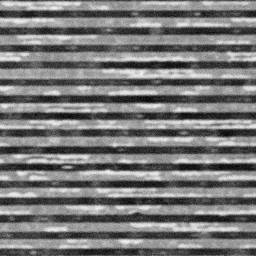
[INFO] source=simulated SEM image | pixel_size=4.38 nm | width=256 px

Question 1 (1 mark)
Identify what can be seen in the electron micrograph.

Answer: parallel lines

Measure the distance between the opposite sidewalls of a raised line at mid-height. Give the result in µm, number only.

0.0399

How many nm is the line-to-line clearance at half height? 36.1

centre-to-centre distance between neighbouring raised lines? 74.4 nanometers